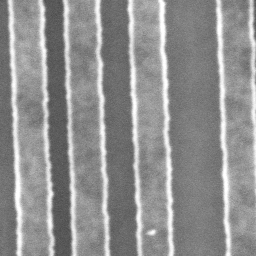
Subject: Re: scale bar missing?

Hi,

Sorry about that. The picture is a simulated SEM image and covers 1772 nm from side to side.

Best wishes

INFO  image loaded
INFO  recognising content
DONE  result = lines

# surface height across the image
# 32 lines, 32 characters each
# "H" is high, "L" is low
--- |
LHHHHLLLHHHHLLLLHHHHLLLLLLLHHHHH
LHHHHLLLHHHHLLLLHHHHLLLLLLLHHHHH
LHHHHLLLHHHHLLLLHHHHLLLLLLLHHHHH
LHHHHLLLHHHHHLLLHHHHLLLLLLLHHHHH
LHHHHLLLHHHHHLLLHHHHLLLLLLLHHHHH
LHHHHLLLHHHHHLLLHHHHLLLLLLLLHHHH
LHHHHHLLHHHHLLLLHHHHLLLLLLLHHHHH
LHHHHHLLHHHHHLLLHHHHHLLLLLLLHHHH
LHHHHHLLHHHHHLLLHHHHHLLLLLLLHHHH
LLHHHHLLHHHHHLLLLHHHHLLLLLLLHHHH
LLHHHHLLHHHHHLLLLHHHHLLLLLLLHHHH
LLHHHHLLHHHHHLLLLHHHHLLLLLLLHHHH
LLHHHHLLHHHHHLLLLHHHHLLLLLLLHHHH
LLHHHHLLLHHHHLLLLHHHHLLLLLLLHHHH
LLHHHHLLLHHHHLLLLHHHHLLLLLLLHHHH
LLHHHHLLLHHHHLLLLHHHHLLLLLLLHHHH
LLHHHHLLLHHHHLLLLHHHHLLLLLLLHHHH
LLHHHHLLLHHHHLLLLHHHHLLLLLLLHHHH
LLHHHHLLLHHHHLLLLHHHHLLLLLLLHHHH
LLHHHHLLLHHHHLLLLHHHHLLLLLLLHHHH
LLHHHHLLLHHHHLLLLHHHHLLLLLLLHHHH
LLHHHHLLLHHHHLLLLHHHHLLLLLLLHHHH
LLHHHHLLLHHHHLLLLHHHHLLLLLLLHHHH
LLHHHHLLLHHHHLLLLHHHHLLLLLLLHHHH
LLHHHHLLLHHHHLLLLHHHHLLLLLLLHHHH
LLHHHHLLLHHHHLLLLHHHHLLLLLLLHHHH
LLHHHHLLLHHHHLLLLHHHHLLLLLLLHHHH
LLHHHHLLLHHHHLLLLHHHHLLLLLLLHHHH
LLHHHHLLLHHHHLLLLHHHHLLLLLLLHHHH
LLHHHHHLLHHHHLLLLHHHHLLLLLLLHHHH
LLHHHHHLLHHHHLLLLHHHHLLLLLLLHHHH
LLHHHHHLLHHHHLLLLHHHHHLLLLLLHHHH